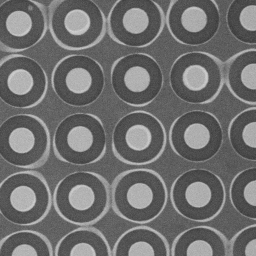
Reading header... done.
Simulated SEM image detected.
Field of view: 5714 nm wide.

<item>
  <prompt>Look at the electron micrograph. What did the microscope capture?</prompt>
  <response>an array of small figures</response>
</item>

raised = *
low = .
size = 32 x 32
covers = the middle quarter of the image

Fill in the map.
.........***............***.....
..***....***....****....***....*
.*****....**....*****....**...**
.******...**...******....*....**
.******...**...******....**....*
.*****....**....*****...***....*
..***.....**.....***....***.....
.........****..........*****....
........******........*******...
.......********......**********.
***.**************.*************
********************************
***..***********.....*********..
*.......*******........******...
.........*****..........****....
..........***............**.....
..****....***...*****....**....*
.******...**....*****....*....**
.******....*....*****....**...**
.******...**....*****....**...**
.******...**.....****....**....*
...**.....***............***....
..........***...........*****...
.........*****.........*******..
*......*********.....***********
********************************
******************...***********
**......*******........*******..
.........*****..........****....
..........***............***....
...........**....****....**....*
..*****....*....******....*....*